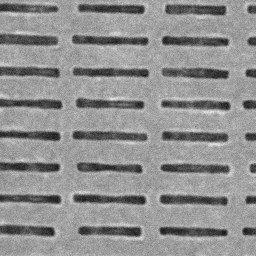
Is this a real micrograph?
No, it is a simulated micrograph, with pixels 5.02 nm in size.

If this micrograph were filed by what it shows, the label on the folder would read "a regular array of holes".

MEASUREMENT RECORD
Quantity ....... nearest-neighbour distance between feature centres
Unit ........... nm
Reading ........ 159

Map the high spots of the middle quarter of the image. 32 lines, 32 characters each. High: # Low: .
################################
##...................####.......
##...................####.......
####################.###########
################################
################################
################################
################################
####.###########################
###.................####........
###.................####........
##############################..
################################
################################
################################
################################
################################
##...................###........
##...................###........
################....############
################################
################################
################################
################################
####..##########################
###................#####........
####................####........
##################.#############
################################
################################
################################
################################